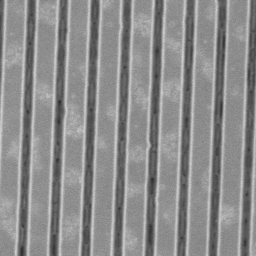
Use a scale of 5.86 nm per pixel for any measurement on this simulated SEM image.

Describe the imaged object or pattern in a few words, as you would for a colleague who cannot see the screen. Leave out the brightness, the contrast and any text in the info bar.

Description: parallel lines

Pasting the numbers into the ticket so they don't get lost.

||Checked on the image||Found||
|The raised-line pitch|186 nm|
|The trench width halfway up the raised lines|0.0534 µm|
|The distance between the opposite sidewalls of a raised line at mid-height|133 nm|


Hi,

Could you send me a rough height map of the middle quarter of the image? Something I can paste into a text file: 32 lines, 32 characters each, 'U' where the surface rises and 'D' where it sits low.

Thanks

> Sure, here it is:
UUUUUUDDUUUUUUDDUUUUUUDDUUUUUUDD
UUUUUUDDUUUUUUDDUUUUUUDDUUUUUUDD
UUUUUUDDUUUUUUDDUUUUUUDDUUUUUUDD
UUUUUUDDUUUUUUDDUUUUUUDDUUUUUUDD
UUUUUUDDUUUUUUDDUUUUUUDDUUUUUUDD
UUUUUUDDUUUUUUDDUUUUUUDDUUUUUUDD
UUUUUUDDUUUUUUDDUUUUUUDDUUUUUDDD
UUUUUUDDUUUUUUDDUUUUUUDDUUUUUUDD
UUUUUUDDUUUUUUDDUUUUUUDDUUUUUUDD
UUUUUUDDUUUUUUDDUUUUUUDDUUUUUUDD
UUUUUUDDUUUUUUDDUUUUUUDDUUUUUDDD
UUUUUUDDUUUUUUDDUUUUUDDDUUUUUDDD
UUUUUDDDUUUUUDDDUUUUUDDDUUUUUDDD
UUUUUDDDUUUUUDDDUUUUUDDDUUUUUDDD
UUUUUDDDUUUUUDDDUUUUUDDDUUUUUDDD
UUUUUDDDUUUUUDDDUUUUUDDDUUUUUDDD
UUUUUDDDUUUUUDDDUUUUUDDDUUUUUDDD
UUUUUDDDUUUUUDDDUUUUUDDDUUUUUDDD
UUUUUDDDUUUUUDDDUUUUUDDDUUUUUDDD
UUUUUDDDUUUUUDDDUUUUUDDDUUUUUDDD
UUUUUDDDUUUUUDDDUUUUUDDDUUUUUDDD
UUUUUDDDUUUUUDDDUUUUUDDDUUUUUDDD
UUUUUDDDUUUUUDDDUUUUUDDDUUUUUDDD
UUUUUDDDUUUUUDDDUUUUUDDDUUUUUDDD
UUUUUDDDUUUUUDDDUUUUUDDUUUUUUDDU
UUUUUDDUUUUUUDDUUUUUUDDUUUUUUDDU
UUUUUDDUUUUUUDDUUUUUUDDUUUUUUDDU
UUUUUDDUUUUUUDDUUUUUUDDUUUUUUDDU
UUUUUDDUUUUUUDDUUUUUUDDUUUUUUDDU
UUUUUDDUUUUUUDDUUUUUUDDUUUUUUDDU
UUUUUDDUUUUUUDDUUUUUUDDUUUUUUDDU
UUUUUDDUUUUUUDDUUUUUUDDUUUUUUDDU